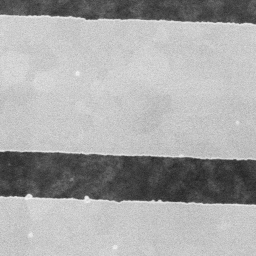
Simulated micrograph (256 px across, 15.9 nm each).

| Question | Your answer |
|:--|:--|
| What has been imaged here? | one or a few lines or trenches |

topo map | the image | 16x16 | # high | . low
................
################
################
################
################
################
################
################
################
....############
................
................
######..........
################
################
################